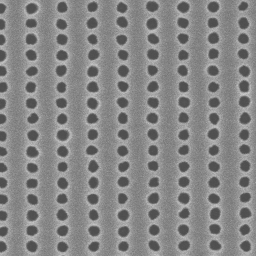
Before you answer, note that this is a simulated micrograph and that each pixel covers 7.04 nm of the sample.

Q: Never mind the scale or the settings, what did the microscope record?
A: a regular array of holes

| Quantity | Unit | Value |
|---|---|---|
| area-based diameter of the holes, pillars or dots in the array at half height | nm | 76.6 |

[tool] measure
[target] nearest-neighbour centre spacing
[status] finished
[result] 109 nm